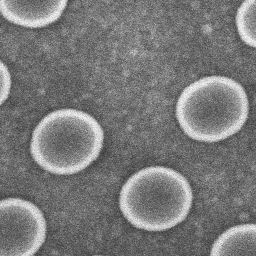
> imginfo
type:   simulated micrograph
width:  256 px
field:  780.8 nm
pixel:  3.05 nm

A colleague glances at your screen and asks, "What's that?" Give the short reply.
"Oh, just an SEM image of raised bodies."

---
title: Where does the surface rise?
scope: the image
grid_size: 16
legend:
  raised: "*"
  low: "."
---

****...........*
...............*
................
................
................
............***.
...........****.
...***.....****.
..****......**..
..****..........
...**...........
........****....
........****....
**......***.....
***...........**
**...........***